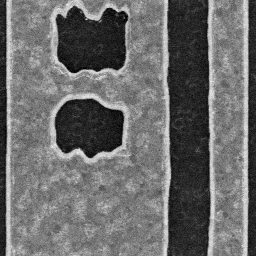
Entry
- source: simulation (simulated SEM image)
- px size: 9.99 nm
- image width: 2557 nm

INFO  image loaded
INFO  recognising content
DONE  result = one or a few lines or trenches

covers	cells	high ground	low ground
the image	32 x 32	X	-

-XXXXXXXX-XXXXXXXXXXX-----XXXXX-
-XXXXXX----XX---XXXXX-----XXXXX-
-XXXXXX---------XXXXX-----XXXXX-
-XXXXXX---------XXXXX-----XXXXX-
-XXXXXX---------XXXXX-----XXXXX-
-XXXXXX---------XXXXX-----XXXXX-
-XXXXXX---------XXXXX-----XXXXX-
-XXXXXX---------XXXXX-----XXXXX-
-XXXXXXX-------XXXXXX-----XXXXX-
-XXXXXXXXXXXXXXXXXXXX-----XXXXX-
-XXXXXXXXXXXXXXXXXXXX-----XXXXX-
-XXXXXXXXXXXXXXXXXXXX-----XXXXX-
-XXXXXXX----XXXXXXXXX-----XXXXX-
-XXXXXX--------XXXXXX-----XXXXX-
-XXXXXX---------XXXXX-----XXXXX-
-XXXXXX---------XXXXX-----XXXXX-
-XXXXXX---------XXXXX-----XXXXX-
-XXXXXX---------XXXXX------XXXX-
-XXXXXX--------XXXXXX-----XXXXX-
-XXXXXXX-X--XXXXXXXXX-----XXXXX-
-XXXXXXXXXXXXXXXXXXXX-----XXXXX-
-XXXXXXXXXXXXXXXXXXXX-----XXXXX-
-XXXXXXXXXXXXXXXXXXXX-----XXXXX-
-XXXXXXXXXXXXXXXXXXXX------XXXX-
-XXXXXXXXXXXXXXXXXXXX------XXXX-
-XXXXXXXXXXXXXXXXXXXX------XXXX-
-XXXXXXXXXXXXXXXXXXXX------XXXX-
-XXXXXXXXXXXXXXXXXXXX------XXXX-
-XXXXXXXXXXXXXXXXXXXX-----XXXXX-
-XXXXXXXXXXXXXXXXXXXX-----XXXXX-
-XXXXXXXXXXXXXXXXXXXX-----XXXXX-
-XXXXXXXXXXXXXXXXXXXX-----XXXXX-